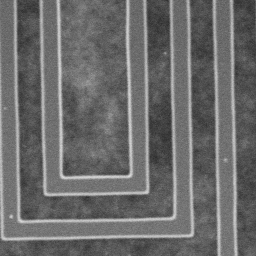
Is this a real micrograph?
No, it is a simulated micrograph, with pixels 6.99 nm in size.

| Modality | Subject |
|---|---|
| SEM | groups of lines, slits or small figures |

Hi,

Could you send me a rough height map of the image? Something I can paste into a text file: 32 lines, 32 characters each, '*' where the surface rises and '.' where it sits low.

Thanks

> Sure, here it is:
**...**.........**...***...**...
**...**.........**...***...**...
**...**.........**...***...**...
**...**.........**...***...**...
**...**.........**...***...**...
**...**.........**...***...**...
**...**.........**...***...**...
**...**.........**...***...**...
**...**.........**...***...**...
**...**.........**...***...**...
**...**.........**...***...**...
**...**.........**...***...**...
**...***........**....**...**...
**...***........**....**...**...
**...***........**....**...**...
**...***........**....**...**...
**...***........**....**...**...
**...***........**....**...**...
**...***........**....**...**...
**...***........**....**...**...
**...***........**....**...**...
**....**........**....**...**...
**....************....**...**...
**....*************...**...**...
**....................**...**...
**....................**...**...
**....................**...**...
***.............********...**...
************************...**...
************************...**...
...........................**...
...........................**...